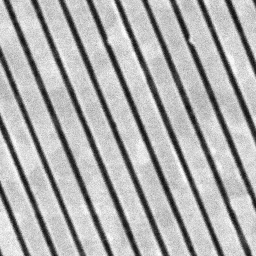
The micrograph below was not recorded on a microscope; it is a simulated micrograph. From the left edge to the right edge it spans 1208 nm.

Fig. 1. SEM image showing parallel lines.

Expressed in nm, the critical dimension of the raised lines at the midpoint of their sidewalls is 84.7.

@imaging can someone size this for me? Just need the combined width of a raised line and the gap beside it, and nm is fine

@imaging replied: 121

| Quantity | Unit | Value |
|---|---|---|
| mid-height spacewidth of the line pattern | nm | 35.5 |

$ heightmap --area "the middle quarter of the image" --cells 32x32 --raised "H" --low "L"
HHHHHLLHHHHHLLHHHHHLLHHHHHLLHHHH
HHHHHLLLHHHHLLHHHHHLLHHHHHLLLHHH
LHHHHHLLHHHHHLLHHHHHLLHHHHHLLHHH
LLHHHHLLHHHHHLLHHHHHLLHHHHHLLHHH
LLHHHHHLLHHHHHLLHHHHLLLHHHHLLLHH
LLHHHHHLLHHHHHLLHHHHHLLHHHHHLLHH
HLLHHHHHLLHHHHLLLHHHHLLLHHHHLLLH
HLLHHHHHLLHHHHHLLHHHHHLLHHHHHLLH
HLLLHHHHLLHHHHHLLHHHHHLLHHHHHLLH
HHLLHHHHHLLHHHHHLLHHHHHLLHHHHLLL
HHLLHHHHHLLHHHHHLLHHHHHLLHHHHHLL
HHHLLHHHHHLLHHHHLLLHHHHLLHHHHHLL
HHHLLHHHHHLLHHHHHLLHHHHHLLHHHHHL
HHHHLLHHHHLLHHHHHLLHHHHHLLHHHHHL
HHHHLLHHHHHLLHHHHHLLHHHHHLLHHHHL
HHHHLLHHHHHLLHHHHHLLHHHHHLLHHHHH
HHHHHLLHHHHHLLHHHHHLLHHHHLLHHHHH
HHHHHLLHHHHHLLHHHHHLLHHHHHLLHHHH
LHHHHHLLHHHHLLLHHHHLLHHHHHLLHHHH
LHHHHHLLHHHHHLLHHHHHLLHHHHHLLHHH
LHHHHHLLHHHHHLLHHHHHLLHHHHHLLHHH
LLHHHHHLLHHHHHLLHHHHHLLHHHHLLLHH
LLHHHHHLLHHHHHLLHHHHHLLHHHHHLLHH
HLLHHHHHLLHHHHLLLHHHHLLHHHHHLLHH
HLLHHHHHLLHHHHHLLHHHHHLLHHHHHLLH
HHLHHHHHLLLHHHHLLHHHHHLLHHHHHLLH
HHLLHHHHHLLHHHHHLLHHHHHLLHHHHLLL
HHLLHHHHHLLHHHHHLLHHHHHLLHHHHHLL
HHHLLHHHHHLLHHHHHLLHHHHLLLHHHHLL
HHHLLHHHHHLLHHHHHLLHHHHHLLHHHHHL
HHHHLHHHHHLLLHHHHLLHHHHHLLHHHHHL
HHHHLLHHHHHLLHHHHHLLHHHHHLLHHHHH